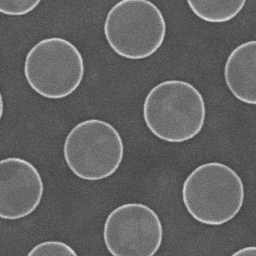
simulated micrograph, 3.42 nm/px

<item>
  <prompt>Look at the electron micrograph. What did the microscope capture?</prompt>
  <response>raised bodies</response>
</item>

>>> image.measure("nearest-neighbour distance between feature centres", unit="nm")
309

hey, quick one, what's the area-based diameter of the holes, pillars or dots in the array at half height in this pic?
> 201 nm